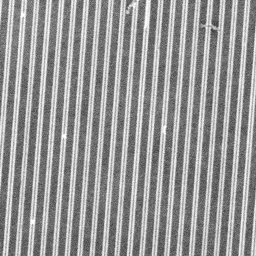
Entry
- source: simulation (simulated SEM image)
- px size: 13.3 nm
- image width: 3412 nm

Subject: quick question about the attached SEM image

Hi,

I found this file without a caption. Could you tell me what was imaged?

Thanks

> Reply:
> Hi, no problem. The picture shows parallel lines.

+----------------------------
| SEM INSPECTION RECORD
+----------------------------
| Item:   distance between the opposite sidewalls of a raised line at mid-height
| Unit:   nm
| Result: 38.2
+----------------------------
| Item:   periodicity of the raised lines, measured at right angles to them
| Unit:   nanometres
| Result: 165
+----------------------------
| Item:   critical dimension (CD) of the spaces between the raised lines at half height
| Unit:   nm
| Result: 126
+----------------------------